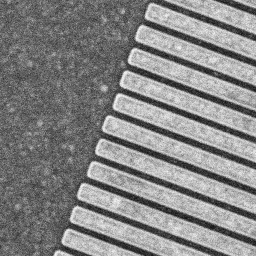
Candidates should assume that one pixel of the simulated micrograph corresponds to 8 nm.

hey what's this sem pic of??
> parallel lines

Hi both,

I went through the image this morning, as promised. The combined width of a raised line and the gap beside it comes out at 190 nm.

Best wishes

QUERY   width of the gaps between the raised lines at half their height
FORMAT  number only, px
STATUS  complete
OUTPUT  8.55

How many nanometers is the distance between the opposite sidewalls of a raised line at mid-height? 121